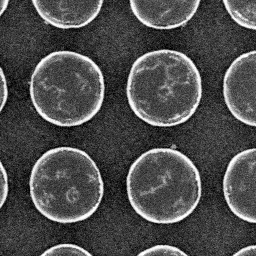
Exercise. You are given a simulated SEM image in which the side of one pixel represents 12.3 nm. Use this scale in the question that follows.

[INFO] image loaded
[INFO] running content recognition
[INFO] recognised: raised bodies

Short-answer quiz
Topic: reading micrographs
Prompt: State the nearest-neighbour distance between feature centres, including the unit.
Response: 1190 nm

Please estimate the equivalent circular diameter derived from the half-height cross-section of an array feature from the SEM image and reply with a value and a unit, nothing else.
0.891 micrometres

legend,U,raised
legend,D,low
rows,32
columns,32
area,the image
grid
UDDDUUUUUUUUUDDDDUUUUUUUUDDDUUUU
DDDDDUUUUUUUDDDDDUUUUUUUDDDDDUUU
DDDDDDUUUUUDDDDDDDUUUUUDDDDDDDUU
DDDDDDDDDDDDDDDDDDDDDDDDDDDDDDDU
DDDDDDDDDDDDDDDDDDDDDDDDDDDDDDDD
DDDDDDDDDDDDDDDDDDDDDDDDDDDDDDDD
DDDDDDDDDDDDDDDDDDDDUUDDDDDDDDDD
DDDDDDUUUUUDDDDDDUUUUUUUDDDDDDUU
DDDDDUUUUUUUDDDDDUUUUUUUDDDDDUUU
DDDDUUUUUUUUUDDDUUUUUUUUUDDDUUUU
UDDDUUUUUUUUUDDDUUUUUUUUUDDDUUUU
UDDDUUUUUUUUUDDDUUUUUUUUUDDDUUUU
UDDDUUUUUUUUUDDDUUUUUUUUUDDDUUUU
DDDDDUUUUUUUDDDDDUUUUUUUDDDDDUUU
DDDDDUUUUUUDDDDDDDUUUUUUDDDDDUUU
DDDDDDDUUUDDDDDDDDDUUUDDDDDDDDDU
DDDDDDDDDDDDDDDDDDDDDDDDDDDDDDDD
DDDDDDDDDDDDDDDDDDDDDDDDDDDDDDDD
DDDDDDDDDDDDDDDDDDDDDDDDDDDDDDDD
DDDDDDUUUUUDDDDDDDUUUUUDDDDDDDUU
DDDDDUUUUUUUDDDDDUUUUUUUDDDDDUUU
DDDDUUUUUUUUDDDDUUUUUUUUUDDDUUUU
UDDDUUUUUUUUUDDDUUUUUUUUUDDDUUUU
UDDDUUUUUUUUUDDDUUUUUUUUUDDDUUUU
UDDDUUUUUUUUUDDDUUUUUUUUUDDDUUUU
DDDDUUUUUUUUDDDDDUUUUUUUDDDDDUUU
DDDDDUUUUUUUDDDDDUUUUUUUDDDDDUUU
DDDDDDDUUUDDDDDDDDDUUUDDDDDDDDDU
DDDDDDDDDDDDDDDDDDDDDDDDDDDDDDDD
DDDDDDDDDDDDDDDDDDDDDDDDDDDDDDDD
DDDDDDDDDDDDDDDDDDDDDDDDDDDDDDDD
DDDDDDUUUUUDDDDDDDUUUUUDDDDDDDUU